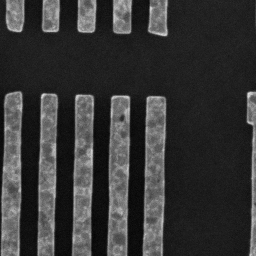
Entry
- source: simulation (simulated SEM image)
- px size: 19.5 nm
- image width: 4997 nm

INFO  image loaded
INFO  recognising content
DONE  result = wiring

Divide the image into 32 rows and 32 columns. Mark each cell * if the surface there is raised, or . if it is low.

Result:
.**..**...**..**...**...........
.**..**...**..**...**...........
.**..**...**..**...**...........
.**..**...**..**...**...........
................................
................................
................................
................................
................................
................................
................................
................................
.**..**...**..**..***..........*
.**..**...**..**..***..........*
.**..**...**..**..***..........*
.**..**...**..**..***..........*
.**..**...**..**..***...........
.**..**...**..**..***...........
.*...**..***..**..**............
**...**..**...**..**............
***..**..**...**..**............
***..**..**...**..**............
***..**..**...**..**...........*
***..**..**...**..**............
***..**..**...**..**............
***..**..**...**..**............
**...**..**...**..**...........*
**...**..**...**..**...........*
**...**..**...**..**...........*
**...**..**...**..**...........*
**...**..**..***..**...........*
**...**..**..***..**...........*